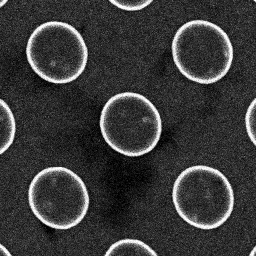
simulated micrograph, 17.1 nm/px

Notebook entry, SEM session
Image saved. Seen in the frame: raised bodies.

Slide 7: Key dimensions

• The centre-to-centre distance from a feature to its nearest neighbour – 103 pixels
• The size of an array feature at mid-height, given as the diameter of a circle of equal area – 1020 nm